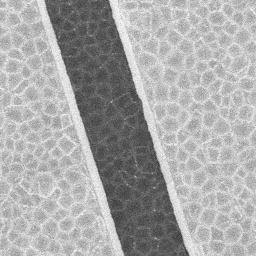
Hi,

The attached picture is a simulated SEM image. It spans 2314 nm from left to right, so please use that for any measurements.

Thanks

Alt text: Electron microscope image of one or a few lines or trenches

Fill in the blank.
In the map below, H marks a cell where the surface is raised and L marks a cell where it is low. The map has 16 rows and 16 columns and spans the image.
HHHLLLLHHHHHHHHH
HHHLLLLHHHHHHHHH
HHHLLLLLHHHHHHHH
HHHHLLLLHHHHHHHH
HHHHLLLLHHHHHHHH
HHHHLLLLLHHHHHHH
HHHHHLLLLHHHHHHH
HHHHHLLLLHHHHHHH
HHHHHLLLLLHHHHHH
HHHHHLLLLLHHHHHH
HHHHHHLLLLHHHHHH
HHHHHHLLLLLHHHHH
HHHHHHLLLLLHHHHH
HHHHHHHLLLLHHHHH
HHHHHHHLLLLLHHHH
HHHHHHHLLLLLHHHH